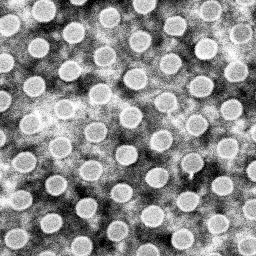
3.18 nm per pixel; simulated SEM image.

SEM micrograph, a regular array of raised bodies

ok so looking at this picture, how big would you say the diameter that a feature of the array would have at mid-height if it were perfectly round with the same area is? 64 nm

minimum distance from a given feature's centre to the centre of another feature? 120 nm